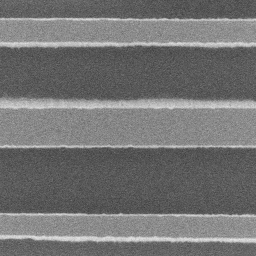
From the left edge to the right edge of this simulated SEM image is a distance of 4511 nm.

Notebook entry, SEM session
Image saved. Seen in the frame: lines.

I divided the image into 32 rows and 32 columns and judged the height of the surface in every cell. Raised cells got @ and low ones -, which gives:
--------------------------------
--------------------------------
@@@@@@@@@@@@@@@@@@@@@@@@@@@@@@@@
@@@@@@@@@@@@@@@@@@@@@@@@@@@@@@@@
@@@@@@@@@@@@@@@@@@@@@@@@@@@@@@@@
----------------------------@---
--------------------------------
--------------------------------
--------------------------------
--------------------------------
--------------------------------
--------------------------------
--------------------------------
@@@@@@@@@@@@@@@@@@@@@@@@@@@@@@@@
@@@@@@@@@@@@@@@@@@@@@@@@@@@@@@@@
@@@@@@@@@@@@@@@@@@@@@@@@@@@@@@@@
@@@@@@@@@@@@@@@@@@@@@@@@@@@@@@@@
@@@@@@@@@@@@@@@@@@@@@@@@@@@@@@@@
--------------------------------
--------------------------------
--------------------------------
--------------------------------
--------------------------------
--------------------------------
--------------------------------
--------------------------------
--------------------------------
@@@@@@@@@@@@@@@@@@@@@@@@@@@@@@@@
@@@@@@@@@@@@@@@@@@@@@@@@@@@@@@@@
@@@@@@@@@@@@@@@@@@@@@@@@@@@@@@@@
--------------------------------
--------------------------------